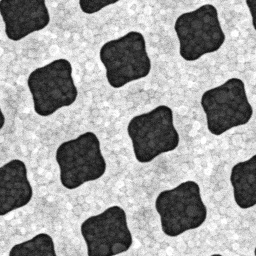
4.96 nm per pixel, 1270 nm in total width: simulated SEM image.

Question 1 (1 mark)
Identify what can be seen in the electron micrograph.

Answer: holes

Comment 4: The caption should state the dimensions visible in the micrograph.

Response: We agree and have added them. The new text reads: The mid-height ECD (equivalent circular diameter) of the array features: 251 nm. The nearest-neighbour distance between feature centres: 388 nanometers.